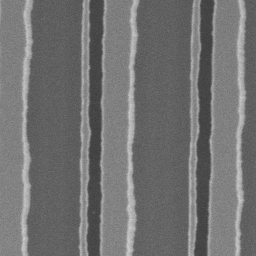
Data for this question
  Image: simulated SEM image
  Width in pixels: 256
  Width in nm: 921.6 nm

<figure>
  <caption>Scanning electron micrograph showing lines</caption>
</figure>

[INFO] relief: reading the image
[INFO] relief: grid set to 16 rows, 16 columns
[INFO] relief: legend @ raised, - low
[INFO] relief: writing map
@@---@@@----@@@-
@@---@@@----@@@-
@@---@@@----@@@-
@@---@@@----@@@-
@@---@@@----@@@-
@@---@@@----@@@-
@@---@@@----@@@-
@@---@@@----@@@-
@@---@@@----@@@-
@@---@@@----@@@-
@@---@@@----@@@-
@@---@@@----@@@-
@@---@@@----@@@-
@@---@@@----@@@-
@@---@@@----@@@-
@@---@@@----@@@-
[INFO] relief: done